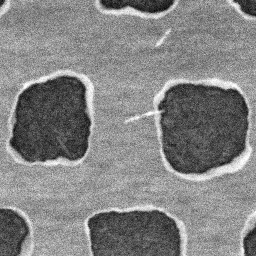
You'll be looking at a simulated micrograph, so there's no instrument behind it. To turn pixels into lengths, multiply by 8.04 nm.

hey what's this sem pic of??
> holes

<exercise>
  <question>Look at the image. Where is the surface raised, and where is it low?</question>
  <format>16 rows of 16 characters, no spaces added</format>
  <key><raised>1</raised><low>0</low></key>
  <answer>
1111111000111110
1111111111111111
1111111111111111
1111111111111111
1111111111111111
1100011111100011
1000011111000001
1000001111000000
1000001111000001
1000011111000001
1111111111100011
1111111111111111
1111111111111111
0111110000011111
0011110000011110
0011110000011110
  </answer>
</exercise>